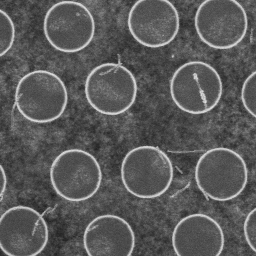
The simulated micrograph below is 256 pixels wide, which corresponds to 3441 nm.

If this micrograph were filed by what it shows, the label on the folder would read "raised bodies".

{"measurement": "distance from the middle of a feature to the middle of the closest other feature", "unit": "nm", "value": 951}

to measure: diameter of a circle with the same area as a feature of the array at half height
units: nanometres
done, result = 675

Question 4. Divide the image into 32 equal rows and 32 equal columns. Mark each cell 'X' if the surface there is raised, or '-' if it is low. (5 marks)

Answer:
-------XXX-------XXXX----XXXXX--
------XXXXX-----XXXXXX---XXXXXX-
X-----XXXXXX----XXXXXX---XXXXXX-
XX----XXXXXX----XXXXXX---XXXXXX-
XX----XXXXXX-----XXXXX---XXXXX--
X-----XXXXX-------XXX-----XXX---
X-------------------------------
--------------------------------
------------XXX--------XXX------
---XXXX----XXXXX------XXXXX----X
---XXXXX---XXXXXX----XXXXXXX---X
--XXXXXX---XXXXXX----XXXXXXX--XX
--XXXXXX---XXXXXX-----XXXXX---XX
--XXXXXX----XXXX-------XXX-----X
---XXXX-------------------------
--------------------------------
--------------------------------
--------------------------------
------------------X-------------
-------XXXX-----XXXXX----XXXXX--
-------XXXXX---XXXXXX----XXXXX--
------XXXXXXX--XXXXXX----XXXXXX-
X-----XXXXXXX--XXXXXX----XXXXXX-
X------XXXXX----XXXXX----XXXXX--
--------XXX------XX-------XXX---
--------------------------------
-XXX----------------------------
XXXXX-------XXX--------XXXX----X
XXXXXX-----XXXXX------XXXXX----X
XXXXXX-----XXXXXX-----XXXXXX---X
XXXXXX-----XXXXXX-----XXXXXX---X
-XXXX------XXXXX------XXXXX-----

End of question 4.